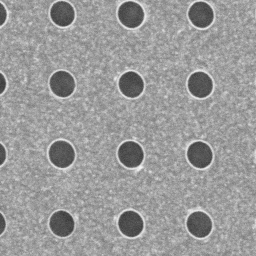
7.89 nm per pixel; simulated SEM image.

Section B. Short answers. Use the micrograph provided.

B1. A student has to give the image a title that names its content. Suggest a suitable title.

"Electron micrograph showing a regular array of holes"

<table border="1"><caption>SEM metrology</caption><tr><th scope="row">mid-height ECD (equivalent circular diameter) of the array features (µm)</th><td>0.213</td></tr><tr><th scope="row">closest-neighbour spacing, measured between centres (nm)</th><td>543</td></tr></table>